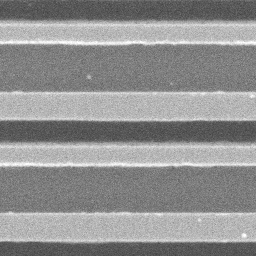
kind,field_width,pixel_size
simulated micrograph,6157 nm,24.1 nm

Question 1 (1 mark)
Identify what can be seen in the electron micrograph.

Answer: lines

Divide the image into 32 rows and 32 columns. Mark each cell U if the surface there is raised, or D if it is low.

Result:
DDDDDDDDDDDDDDDDDDDDDDDDDDDDDDDD
DDDDDDDDDDDDDDDDDDDDDDDDDDDDDDDD
DDDDDDDDDDDDDDDDDDDDDDDDDDDDDDDD
UUUUUUUUUUUUUUUUUUUUUUUUUUUUUUUU
UUUUUUUUUUUUUUUUUUUUUUUUUUUUUUUU
DDDDDDDDDDDDDDDDDDDDDDDDDDDDDDDD
DDDDDDDDDDDDDDDDDDDDDDDDDDDDDDDD
DDDDDDDDDDDDDDDDDDDDDDDDDDDDDDDD
DDDDDDDDDDDDDDDDDDDDDDDDDDDDDDDD
DDDDDDDDDDDDDDDDDDDDDDDDDDDDDDDD
DDDDDDDDDDDDDDDDDDDDDDDDDDDDDDDD
DDDDDDDDDDDDDDDDDDDDDDDDDDDDDDDD
UUUUUUUUUUUUUUUUUUUUUUUUUUUUUUUU
UUUUUUUUUUUUUUUUUUUUUUUUUUUUUUUU
UUUUUUUUUUUUUUUUUUUUUUUUUUUUUUUU
DDDDDDDDDDDDDDDDDDDDDDDDDDDDDDDD
DDDDDDDDDDDDDDDDDDDDDDDDDDDDDDDD
DDDDDDDDDDDDDDDDDDDDDDDDDDDDDDDD
UUUUUUUUUUUUUUUUUUUUUUUUUUUUUUUU
UUUUUUUUUUUUUUUUUUUUUUUUUUUUUUUU
UUUUUUUUUUUUUUUUUUUUUUUDUUUDDUUD
DDDDDDDDDDDDDDDDDDDDDDDDDDDDDDDD
DDDDDDDDDDDDDDDDDDDDDDDDDDDDDDDD
DDDDDDDDDDDDDDDDDDDDDDDDDDDDDDDD
DDDDDDDDDDDDDDDDDDDDDDDDDDDDDDDD
DDDDDDDDDDDDDDDDDDDDDDDDDDDDDDDD
DDDDDDDDDDDDDDDDDDDDDDDDDDDDDDDD
UUUUUUUUUUUUUUUUUUUUUUUUUUUUUUUU
UUUUUUUUUUUUUUUUUUUUUUUUUUUUUUUU
UUUUUUUUUUUUUUUUUUUUUUUUUUUUUUUU
DDDDDDDDDDDDDDDDDDDDDDDDDDDDDDDD
DDDDDDDDDDDDDDDDDDDDDDDDDDDDDDDD